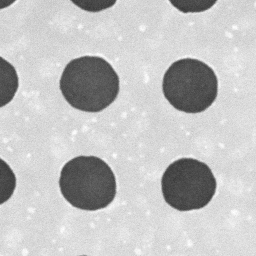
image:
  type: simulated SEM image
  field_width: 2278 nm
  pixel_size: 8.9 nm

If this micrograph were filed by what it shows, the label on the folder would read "holes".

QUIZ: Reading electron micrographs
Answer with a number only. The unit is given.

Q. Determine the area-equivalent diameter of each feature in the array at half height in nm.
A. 500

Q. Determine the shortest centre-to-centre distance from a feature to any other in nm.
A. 883